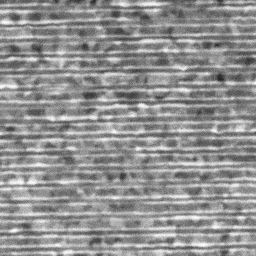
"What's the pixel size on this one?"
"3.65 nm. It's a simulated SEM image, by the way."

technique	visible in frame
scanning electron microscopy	parallel lines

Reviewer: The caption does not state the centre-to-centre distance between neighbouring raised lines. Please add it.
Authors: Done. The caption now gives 0.0588 micrometres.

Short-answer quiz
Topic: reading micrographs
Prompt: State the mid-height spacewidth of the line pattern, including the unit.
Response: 0.0182 microns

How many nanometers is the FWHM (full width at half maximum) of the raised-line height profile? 39.7